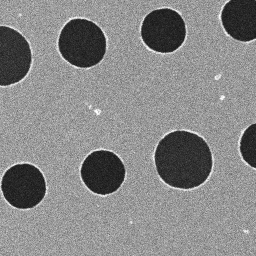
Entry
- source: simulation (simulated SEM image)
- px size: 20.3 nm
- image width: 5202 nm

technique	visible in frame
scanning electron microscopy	holes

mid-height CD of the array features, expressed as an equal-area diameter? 45.3 px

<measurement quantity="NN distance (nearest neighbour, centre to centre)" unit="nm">1650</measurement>